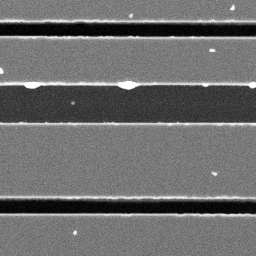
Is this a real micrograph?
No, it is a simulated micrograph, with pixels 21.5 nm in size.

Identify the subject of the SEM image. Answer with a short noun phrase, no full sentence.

lines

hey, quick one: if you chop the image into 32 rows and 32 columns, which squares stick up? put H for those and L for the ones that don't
HHHHHHHHHHHHHHHHHHHHHHHHHHHHHHHH
HHHHHHHHHHHHHHHHHHHHHHHHHHHHHHHH
HHHHHHHHHHHHHHHHHHHHHHHHHHHHHHHH
LLLLLLLLLLLLLLLLLLLLLLLLLLLLLLLL
LLLLLLLLLLLLLLLLLLLLLLLLLLLLLLLL
HHHHHHHHHHHHHHHHHHHHHHHHHHHHHHHH
HHHHHHHHHHHHHHHHHHHHHHHHHHHHHHHH
HHHHHHHHHHHHHHHHHHHHHHHHHHHHHHHH
HHHHHHHHHHHHHHHHHHHHHHHHHHHHHHHH
HHHHHHHHHHHHHHHHHHHHHHHHHHHHHHHH
LLLHHHLLLLLLLLHHHHLLLLLLLHLLLLLH
LLLLLLLLLLLLLLLLLLLLLLLLLLLLLLLL
LLLLLLLLLLLLLLLLLLLLLLLLLLLLLLLL
LLLLLLLLLLLLLLLLLLLLLLLLLLLLLLLL
LLLLLLLLLLLLLLLLLLLLLLLLLLLLLLLL
HHHHHHHHHHHHHHHHHHHHHHHHHHHHHHHH
HHHHHHHHHHHHHHHHHHHHHHHHHHHHHHHH
HHHHHHHHHHHHHHHHHHHHHHHHHHHHHHHH
HHHHHHHHHHHHHHHHHHHHHHHHHHHHHHHH
HHHHHHHHHHHHHHHHHHHHHHHHHHHHHHHH
HHHHHHHHHHHHHHHHHHHHHHHHHHHHHHHH
HHHHHHHHHHHHHHHHHHHHHHHHHHHHHHHH
HHHHHHHHHHHHHHHHHHHHHHHHHHHHHHHH
HHHHHHHHHHHHHHHHHHHHHHHHHHHHHHHH
HHHHHHHHHHHHHHHHHHHHHHHHHHHHHHHH
LLLLLLLLLLLLLLLLLLLLLLLLLLLLLLLL
LLLLLLLLLLLLLLLLLLLLLLLLLLLLLLLL
HHHHHHHHHHHHHHHHHHHHHHHHHHHHHHHH
HHHHHHHHHHHHHHHHHHHHHHHHHHHHHHHH
HHHHHHHHHHHHHHHHHHHHHHHHHHHHHHHH
HHHHHHHHHHHHHHHHHHHHHHHHHHHHHHHH
HHHHHHHHHHHHHHHHHHHHHHHHHHHHHHHH